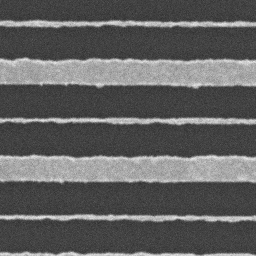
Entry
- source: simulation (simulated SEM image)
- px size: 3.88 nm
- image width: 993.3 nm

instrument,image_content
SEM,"lines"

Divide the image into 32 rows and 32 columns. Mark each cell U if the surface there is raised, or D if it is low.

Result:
DDDDDDDDDDDDDDDDDDDDDDDDDDDDDDDD
DDDDDDDDDDDDDDDDDDDDDDDDDDDDDDDD
DDDDDDDDDDDDDDDDDDDDDDDDDDDDDDDD
DDDDDDDDDDDDDDDDDDDDDDDDDDDDDDDD
DDDDDDDDDDDDDDDDDDDDDDDDDDDDDDDD
DDDDDDDDDDDDDDDDDDDDDDDDDDDDDDDD
DDDDDDDDDDDDDDDDDDDDDDDDDDDDDDDD
UDUUDDDDDDDUUDUDUDDDDDDDDDDDDDDD
UUUUUUUUUUUUUUUUUUUUUUUUUUUUUUUU
UUUUUUUUUUUUUUUUUUUUUUUUUUUUUUUU
DDDDDDDDDDUUUUUUUUUUUUUUUUUUUUUU
DDDDDDDDDDDDDDDDDDDDDDDDDDDDDDDD
DDDDDDDDDDDDDDDDDDDDDDDDDDDDDDDD
DDDDDDDDDDDDDDDDDDDDDDDDDDDDDDDD
DDDDDDDDDDDDDDDDDDDDDDDDDDDDDDDD
DDDDDDDDDDDDDDDDDDDDDDDDDDDDDDDD
DDDDDDDDDDDDDDDDDDDDDDDDDDDDDDDD
DDDDDDDDDDDDDDDDDDDDDDDDDDDDDDDD
DDDDDDDDDDDDDDDDDDDDDDDDDDDDDDDD
DDDDDDDDDDDDDDDDDDDDDDDDDDDDDDDD
UUUUUUUUUUUUUUUUUUUUUUUUUUUUUUUU
UUUUUUUUUUUUUUUUUUUUUUUUUUUUUUUU
UUUUUUUUUUUUUUUUUUUUUUUUUUUUUUUU
DDDDDDDDDDDDDDDDDDDDDDDDDDDDDDDD
DDDDDDDDDDDDDDDDDDDDDDDDDDDDDDDD
DDDDDDDDDDDDDDDDDDDDDDDDDDDDDDDD
DDDDDDDDDDDDDDDDDDDDDDDDDDDDDDDD
DDDDDDDDDDDDDDDDDUDUUDDDDDDDDDDD
DDDDDDDDDDDDDDDDDDDDDDDDDDDDDDDD
DDDDDDDDDDDDDDDDDDDDDDDDDDDDDDDD
DDDDDDDDDDDDDDDDDDDDDDDDDDDDDDDD
DDDDDDDDDDDDDDDDDDDDDDDDDDDDDDDD